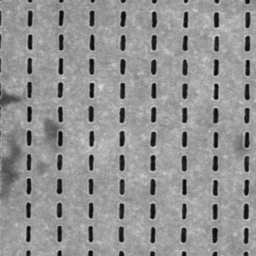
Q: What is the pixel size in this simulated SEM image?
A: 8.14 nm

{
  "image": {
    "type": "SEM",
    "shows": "a regular array of holes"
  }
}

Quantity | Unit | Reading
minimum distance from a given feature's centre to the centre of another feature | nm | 194